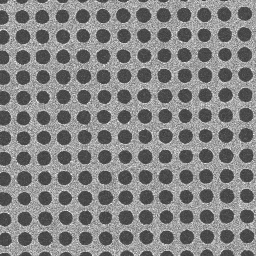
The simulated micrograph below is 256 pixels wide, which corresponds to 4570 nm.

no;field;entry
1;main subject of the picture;a regular array of holes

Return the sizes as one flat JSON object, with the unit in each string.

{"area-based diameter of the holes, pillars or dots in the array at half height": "14.3 px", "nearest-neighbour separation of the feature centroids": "19.9 px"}